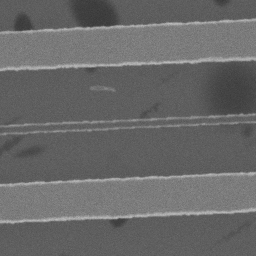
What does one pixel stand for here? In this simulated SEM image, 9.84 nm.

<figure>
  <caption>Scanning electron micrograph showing lines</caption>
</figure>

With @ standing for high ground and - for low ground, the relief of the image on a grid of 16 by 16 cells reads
----------------
----------@@@@@@
@@@@@@@@@@@@@@@@
@@@@@@@@@@@@@@@@
----------------
----------------
----------------
----------@-----
----------------
----------------
----------------
-@@@@@@@@@@@@@@@
@@@@@@@@@@@@@@@@
@@@@@@@@@-------
----------------
----------------